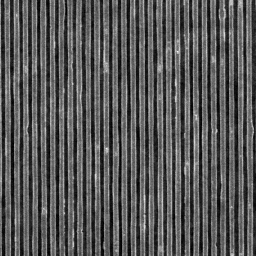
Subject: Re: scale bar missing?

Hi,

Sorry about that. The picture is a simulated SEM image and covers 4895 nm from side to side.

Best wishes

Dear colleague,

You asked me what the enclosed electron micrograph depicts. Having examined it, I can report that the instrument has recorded parallel lines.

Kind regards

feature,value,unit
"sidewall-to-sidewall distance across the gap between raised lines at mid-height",86.1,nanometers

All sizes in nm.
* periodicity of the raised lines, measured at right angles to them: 171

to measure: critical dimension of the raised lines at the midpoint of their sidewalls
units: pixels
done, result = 4.5